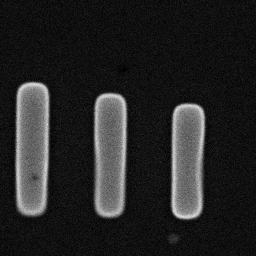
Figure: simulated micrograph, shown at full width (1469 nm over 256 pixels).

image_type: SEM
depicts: groups of lines, slits or small figures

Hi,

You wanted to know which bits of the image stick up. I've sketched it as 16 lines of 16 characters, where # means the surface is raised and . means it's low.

................
................
................
................
................
.##.............
.##...##........
.##...##...##...
.##...##...##...
.##...##...##...
.##...##...##...
.##...##...##...
.##...##...##...
...........#....
................
................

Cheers